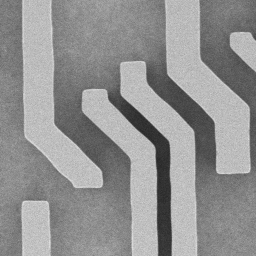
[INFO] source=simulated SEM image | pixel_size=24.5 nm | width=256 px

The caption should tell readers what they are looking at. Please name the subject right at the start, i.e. groups of lines, slits or small figures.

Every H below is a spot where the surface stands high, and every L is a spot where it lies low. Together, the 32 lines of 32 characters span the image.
LLLHHHLLLLLLLLLLLLLLLHHHHLLLLLLL
LLLHHHLLLLLLLLLLLLLLLHHHHLLLLLLL
LLLHHHLLLLLLLLLLLLLLLHHHHLLLLLLL
LLLHHHLLLLLLLLLLLLLLLHHHHLLLLLLL
LLLHHHLLLLLLLLLLLLLLLHHHHLLLLHHH
LLLHHHHLLLLLLLLLLLLLLHHHHLLLLHHH
LLLHHHHLLLLLLLLLLLLLLHHHHLLLLHHH
LLLHHHHLLLLLLLLLLLLLLHHHHLLLLLHH
LLLHHHHLLLLLLLLHHHLLLHHHHHLLLLLH
LLLHHHHLLLLLLLLHHHLLLHHHHHHLLLLL
LLLHHHHLLLLLLLLHHHHLLLHHHHHHLLLL
LLLHHHHLLLLHHLLHHHHLLLLHHHHHHLLL
LLLHHHHLLLHHHHLLHHHHLLLLHHHHHHLL
LLLHHHHLLLHHHHLLLHHHHHLLLHHHHHHL
LLLHHHHLLLLHHHHLLLHHHHHLLLHHHHHL
LLLHHHHLLLLLHHHHLLLHHHHLLLLHHHHL
LLLHHHHHLLLLLHHHHLLLHHHHLLLHHHHL
LLLLHHHHHLLLLLHHHHHLLHHHLLLHHHHL
LLLLLHHHHHLLLLLHHHHLLHHHLLLHHHHL
LLLLLLHHHHHLLLLLHHHLLHHHLLLHHHHL
LLLLLLLHHHHHLLLLHHHHLHHHLLLHHHHL
LLLLLLLHHHHHHLLLHHHHLHHHLLLHHHHL
LLLLLLLLLHHHHLLLHHHHLHHHLLLLLLLL
LLLLLLLLLLLLLLLLHHHHLHHHLLLLLLLL
LLLLLLLLLLLLLLLLHHHHLHHHLLLLLLLL
LLLHHHLLLLLLLLLLHHHHLHHHLLLLLLLL
LLLHHHLLLLLLLLLLLHHHLHHHLLLLLLLL
LLLHHHLLLLLLLLLLLHHHLHHHLLLLLLLL
LLLHHHLLLLLLLLLLLHHHLHHHHLLLLLLL
LLLHHHLLLLLLLLLLLHHHLLHHHLLLLLLL
LLLHHHLLLLLLLLLLLHHHLLHHHLLLLLLL
LLLHHHLLLLLLLLLLLHHHLLHHHLLLLLLL